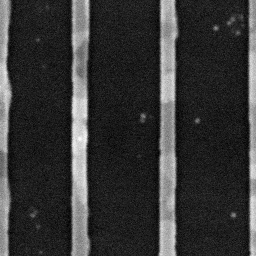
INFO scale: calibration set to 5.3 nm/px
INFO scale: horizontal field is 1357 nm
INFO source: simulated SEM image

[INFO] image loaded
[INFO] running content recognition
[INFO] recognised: lines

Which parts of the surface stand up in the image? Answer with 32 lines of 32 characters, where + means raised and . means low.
+........++.........++.........+
+........++.........++.........+
+........++.........++.........+
+........++.........++.........+
+........++.........++.........+
+........++.........++.........+
+........++.........++.........+
+........++.........++.........+
+........++.........++.........+
+........++.........++.........+
+........++.........++.........+
+........++.........++.........+
+........++.........++.........+
+........++.........++.........+
+........++.........++.........+
+........++.........++.........+
+........++.........++.........+
+........++.........++.........+
+........++.........++.........+
+........++.........++.........+
+........++.........++.........+
+........++.........++.........+
+........++.........++.........+
+........++.........++.........+
+........++.........++.........+
+........++.........++.........+
+........++.........++.........+
+........++.........++.........+
+........++.........++.........+
+........++.........++.........+
+........++.........++.........+
+........++.........++.........+